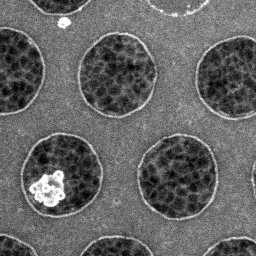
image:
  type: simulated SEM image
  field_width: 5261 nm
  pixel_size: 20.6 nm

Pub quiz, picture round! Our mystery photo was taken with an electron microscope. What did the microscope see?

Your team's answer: raised bodies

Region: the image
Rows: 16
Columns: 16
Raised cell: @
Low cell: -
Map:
--@@@-----------
----------------
@@----@@@-----@@
@@@--@@@@----@@@
@@@--@@@@@--@@@@
@@---@@@@@--@@@@
@@----@@@----@@@
----------------
---@@-----------
--@@@@---@@@@---
-@@@@@---@@@@---
-@@@@@---@@@@---
--@@@@---@@@@---
---@------@@----
----------------
@@---@@@@----@@@